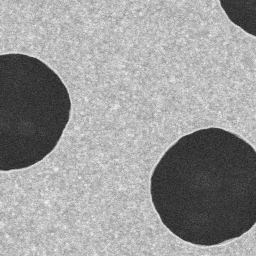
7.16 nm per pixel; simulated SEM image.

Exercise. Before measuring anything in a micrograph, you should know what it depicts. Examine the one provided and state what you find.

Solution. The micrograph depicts holes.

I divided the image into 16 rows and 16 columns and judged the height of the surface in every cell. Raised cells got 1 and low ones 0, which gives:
1111111111111100
1111111111111110
1111111111111111
0011111111111111
0001111111111111
0000111111111111
0000111111111111
0000111111111111
0000111111110001
0001111111000000
0111111111000000
1111111110000000
1111111111000000
1111111111000000
1111111111100001
1111111111111111